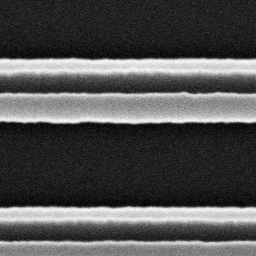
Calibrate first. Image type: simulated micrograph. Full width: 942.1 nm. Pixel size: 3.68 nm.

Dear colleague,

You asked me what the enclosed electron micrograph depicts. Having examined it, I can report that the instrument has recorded lines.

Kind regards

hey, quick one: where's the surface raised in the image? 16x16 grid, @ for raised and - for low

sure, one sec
----------------
----------------
----------------
----------------
@@@@@@@@@@@@@@@@
@@@@@@@@@@@@@@@@
@@@@@@@@@@@@@@@@
@@@@@@@@@@@@@@@@
----------------
----------------
----------------
----------------
----------------
@@@@@@@@@@@@@@@@
@@@@@@@@@@@@@@@@
@@@@@@@@@@@@@@@@